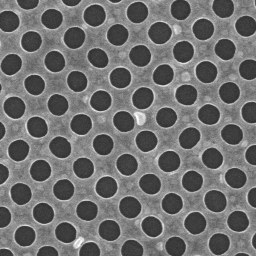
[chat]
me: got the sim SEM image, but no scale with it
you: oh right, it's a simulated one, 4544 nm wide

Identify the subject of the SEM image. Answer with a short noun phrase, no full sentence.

a regular array of holes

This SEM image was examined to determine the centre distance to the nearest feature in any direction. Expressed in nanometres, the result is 529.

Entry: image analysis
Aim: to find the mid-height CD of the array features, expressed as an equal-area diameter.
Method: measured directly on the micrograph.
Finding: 385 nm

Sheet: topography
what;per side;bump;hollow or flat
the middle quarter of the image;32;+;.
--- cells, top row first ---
+++++++....+++++++..++++..++++++
++++++++++++....+++++++....+++++
+....++++++......+++++......++++
+.....+++++......+++++.....+++++
+.....+++++......++++++....+++++
+.....++++++....+++++++++++++...
++...+++++++++++++....++++++....
+++++++....++++++.....++++++....
+++++++.....+++++......+++++....
.+++++......+++++.....+++++++...
.++++++.....++++++....++++++++++
.+++++++...+++++++++++++....++++
+++..++++++++....++++++.....++++
++....++++++.....++++++.....++++
++.....+++++......+++++.....++++
+......++++++.....++++++...+++++
++....++++++++...+++++++++++++..
+++...++++++++++++.....++++++...
++++++++....++++++.....++++++...
.++++++.....++++++.....++++++...
..+++++.....++++++.....++++++...
..++++++....+++++++...++++++++++
..++++++...++++.++++++++....++++
++++..++++++++....++++++.....+++
++.....++++++.....++++++.....+++
++.....++++++.....++++++.....+++
++......+++++.....++++++....++++
+++....+++++++...++++.++++++++..
++++..+++...+++++++.....+++++...
..++++++.....++++++.....+++++...
..++++++.....++++++.....++++++..
...+++++.....++++++.....+++++++.